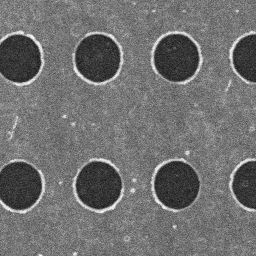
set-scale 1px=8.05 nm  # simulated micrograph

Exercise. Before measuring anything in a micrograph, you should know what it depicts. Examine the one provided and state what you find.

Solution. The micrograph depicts holes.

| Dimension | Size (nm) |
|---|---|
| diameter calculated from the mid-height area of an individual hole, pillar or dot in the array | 378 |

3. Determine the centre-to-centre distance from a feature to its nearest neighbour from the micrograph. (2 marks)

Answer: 631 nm